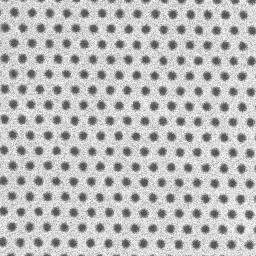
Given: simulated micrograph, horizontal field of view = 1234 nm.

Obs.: a regular array of holes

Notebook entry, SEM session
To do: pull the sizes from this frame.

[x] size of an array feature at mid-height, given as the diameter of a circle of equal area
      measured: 9.5 pixels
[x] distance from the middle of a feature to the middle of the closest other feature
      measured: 83.1 nm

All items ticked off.